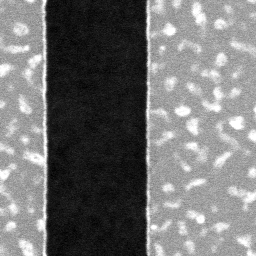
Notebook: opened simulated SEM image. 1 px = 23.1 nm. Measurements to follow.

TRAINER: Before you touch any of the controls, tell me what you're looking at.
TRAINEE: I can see one or a few lines or trenches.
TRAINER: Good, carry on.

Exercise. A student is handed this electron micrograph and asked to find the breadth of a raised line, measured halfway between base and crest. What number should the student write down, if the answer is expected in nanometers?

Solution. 2400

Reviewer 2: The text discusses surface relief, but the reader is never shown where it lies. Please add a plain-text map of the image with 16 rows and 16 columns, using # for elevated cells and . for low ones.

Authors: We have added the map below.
...######.......
...######.......
...######.......
...######.......
...######.......
...######.......
...######.......
...######.......
...######.......
...######.......
...######.......
...######.......
...######.......
...######.......
...######.......
...######.......